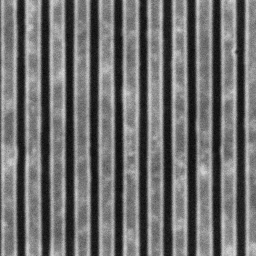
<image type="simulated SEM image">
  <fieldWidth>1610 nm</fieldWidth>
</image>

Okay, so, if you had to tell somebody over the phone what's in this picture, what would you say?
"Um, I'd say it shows parallel lines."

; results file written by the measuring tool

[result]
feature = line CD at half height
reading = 86.5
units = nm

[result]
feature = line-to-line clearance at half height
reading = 67.6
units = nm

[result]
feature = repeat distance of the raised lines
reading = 24.4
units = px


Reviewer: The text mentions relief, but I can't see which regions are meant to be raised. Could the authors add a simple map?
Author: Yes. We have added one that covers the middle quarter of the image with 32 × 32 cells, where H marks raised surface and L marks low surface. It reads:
LLLHHHLLLHHHLLLHHHLLLHHHLLLHHHHL
LLLHHHLLLHHHLLLHHHLLLHHHLLLHHHHL
LLLHHHLLLHHHLLLHHHLLLHHHLLLHHHHL
LLLHHHLLLHHHLLLHHHLLLHHHLLLHHHHL
LLLHHHLLLHHHLLLHHHLLLHHHLLLHHHHL
LLLHHHLLLHHHLLLHHHLLLHHHLLLHHHHL
LLLHHHLLLHHHLLLHHHLLLHHHLLLHHHHL
LLLHHHLLLHHHLLLHHHLLLHHHLLLHHHHL
LLLHHHLLLHHHLLLHHHLLLHHHLLLHHHHL
LLLHHHLLLHHHLLLHHHLLLHHHLLLHHHHL
LLLHHHLLLHHHLLLHHHLLLHHHLLLHHHHL
LLLHHHLLLHHHLLLHHHLLLHHHLLLHHHHL
LLLHHHLLLHHHLLLHHHLLLHHHLLLHHHHL
LLLHHHLLLHHHLLLHHHLLLHHHLLLHHHHL
LLLHHHLLLHHHLLLHHHLLLHHHLLLHHHHL
LLLHHHLLLHHHLLLHHHLLLHHHLLLHHHHL
LLLHHHLLLHHHLLLHHHLLLHHHLLLHHHHL
LLLHHHLLLHHHLLLHHHLLLHHHLLLHHHHL
LLLHHHLLLHHHLLLHHHLLLHHHLLLHHHHL
LLLHHHLLLHHHLLLHHHLLLHHHLLLHHHHL
LLLHHHLLLHHHLLLHHHLLLHHHLLLHHHHL
LLLHHHLLLHHHLLLHHHLLLHHHLLLHHHHL
LLLHHHLLLHHHLLLHHHLLLHHHLLLHHHHL
LLLHHHLLLHHHLLLHHHLLLHHHLLLHHHHL
LLLHHHLLLHHHLLLHHHLLLHHHLLLHHHHL
LLLHHHLLLHHHLLLHHHLLLHHHLLLHHHHL
LLLHHHLLLHHHLLLHHHLLLHHHLLLHHHHL
LLLHHHLLLHHHLLLHHHHLLHHHLLLHHHHL
LLLHHHLLLHHHLLLHHHLLLHHHLLLHHHHL
LLLHHHLLLHHHLLLHHHLLLHHHLLLHHHHL
LLLHHHLLLHHHLLLHHHLLLHHHLLLHHHHL
LLLHHHLLLHHHLLLHHHLLLHHHLLLHHHHL